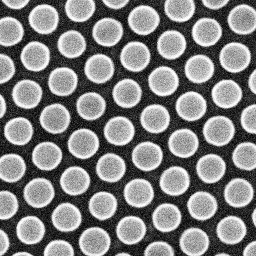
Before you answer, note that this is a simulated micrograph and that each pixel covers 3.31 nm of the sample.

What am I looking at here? a regular array of raised bodies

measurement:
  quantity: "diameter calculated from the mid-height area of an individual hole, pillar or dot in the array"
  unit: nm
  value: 90.5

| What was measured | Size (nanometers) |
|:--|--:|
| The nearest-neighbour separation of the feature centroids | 123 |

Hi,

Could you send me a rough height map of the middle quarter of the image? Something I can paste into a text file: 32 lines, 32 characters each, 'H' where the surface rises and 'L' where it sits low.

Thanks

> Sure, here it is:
LLLLLLHHHHHHLLLHHHHHLLLLLLLLLLLH
HLLLLHHHHHHHLLLLLHHLLLLHHHHLLLLH
HHHLLLHHHHHHLLLLLLLLLLHHHHHHLLLH
HHHLLLHHHHHLLLLLLLLLLHHHHHHHLLLH
HHHLLLLLHHLLLLHHHLLLLHHHHHHHLLLL
HHHLLLLLLLLLLHHHHHLLLLHHHHHHLLLL
HHLLLLLLLLLLLHHHHHHLLLHHHHHHLLLL
HLLLLLHHLLLLHHHHHHHLLLLHHHLLLLLH
LLLLHHHHHLLLLHHHHHHLLLLLLLLLLHHH
LLLLHHHHHHLLLHHHHHLLLLLLLLLLHHHH
LLLLHHHHHHLLLLLHHLLLLLLHLLLLHHHH
HLLLHHHHHHLLLLLLLLLLHHHHHLLLHHHH
HLLLHHHHHLLLLLLLLLLLHHHHHHLLLHHH
HLLLLHHHLLLLLHHLLLLHHHHHHHLLLLHH
HLLLLLLLLLLHHHHHLLLLHHHHHHLLLLLL
HLLLLLLLLLLHHHHHHLLLHHHHHHLLLLLL
LLLLLHLLLLHHHHHHHLLLLHHHHLLLLLHL
LLHHHHHLLLHHHHHHHLLLLLLLLLLLHHHH
LLHHHHHHLLLHHHHHHLLLLLLLLLLHHHHH
LHHHHHHHLLLLHHHHLLLLLLLLLLHHHHHH
LHHHHHHHLLLLLLLLLLLHHHHLLLLHHHHH
LLHHHHHHLLLLLLLLLLHHHHHHLLLHHHHH
LLHHHHHLLLLLLLLLLHHHHHHHLLLLHHHH
LLLLLLLLLHHHHHLLLHHHHHHHLLLLLLLL
LLLLLLLLLHHHHHHLLLHHHHHHLLLLLLLL
LLLLLLLLHHHHHHHLLLHHHHHLLLLLLLLL
LHHHHLLLHHHHHHHLLLLLLLLLLLHHHHLL
HHHHHHLLLHHHHHHLLLLLLLLLLHHHHHHL
HHHHHHLLLHHHHHLLLLLLLLLLHHHHHHHL
HHHHHHLLLLLLLLLLLHHHHLLLHHHHHHHL
HHHHHHLLLLLLLLLLHHHHHHLLHHHHHHHL
HHHHHLLLLLLLLLLHHHHHHHLLLHHHHHLL